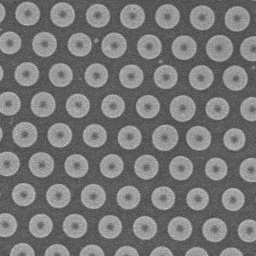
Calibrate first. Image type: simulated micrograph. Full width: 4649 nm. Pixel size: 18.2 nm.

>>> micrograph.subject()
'an array of small figures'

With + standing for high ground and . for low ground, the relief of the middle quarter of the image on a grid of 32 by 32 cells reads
+.....++++......++......++......
++....+++++...+++++....+++++....
++...++++++...++++++...+++++...+
++...++++++...++++++...+++++...+
+.....++++....+++++....+++++....
.......++......+++......+++.....
................................
................................
.+++++....++++.....++++.....+++.
.+++++....+++++...++++++...+++++
.+++++...++++++...++++++...+++++
.+++++....+++++...++++++...+++++
.+++++....++++.....++++....+++++
............................++++
................................
+.....+++...............+++.....
++...+++++....+++++....+++++...+
++...+++++....+++++...++++++...+
++...+++++....+++++...++++++...+
+....+++++....+++++...++++++...+
.......++.....++++.....+++++...+
........................++......
................................
.++++.....++++.....++++.....+++.
++++++...++++++...+++++....+++++
++++++...++++++...+++++...++++++
++++++...++++++...+++++....+++++
.++++.....++++....+++++....+++++
...................+++......+++.
................................
......+++.......................
+....+++++....++++.....++++.....